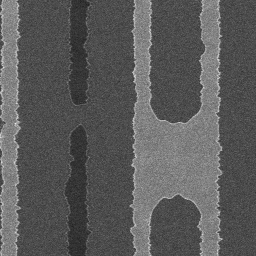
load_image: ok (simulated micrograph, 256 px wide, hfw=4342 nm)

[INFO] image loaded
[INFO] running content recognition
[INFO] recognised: one or a few lines or trenches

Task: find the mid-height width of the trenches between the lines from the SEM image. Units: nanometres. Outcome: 850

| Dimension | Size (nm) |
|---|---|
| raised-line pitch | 1130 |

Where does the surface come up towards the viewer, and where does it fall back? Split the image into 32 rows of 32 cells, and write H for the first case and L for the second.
HHLLLLLLLHHLLLLLLHHLLLLLLHHLLLLL
HHLLLLLLLHHLLLLLLHHLLLLLLHHLLLLL
HHLLLLLLLHHLLLLLLHHLLLLLLHHLLLLL
HHLLLLLLLHHLLLLLLHHLLLLLLHHLLLLL
HHLLLLLLLHHLLLLLLHHLLLLLLHHLLLLL
HHLLLLLLLHHLLLLLLHHLLLLLLLHLLLLL
HHLLLLLLLHHLLLLLLHHLLLLLLLHLLLLL
HHLLLLLLLHHLLLLLLHHLLLLLLHHLLLLL
HHLLLLLLLHHLLLLLLHHLLLLLLHHLLLLL
HHLLLLLLLHHLLLLLLHHLLLLLLHHLLLLL
HHLLLLLLLHHLLLLLLHHLLLLLLHHLLLLL
HHLLLLLLLHHLLLLLLHHLLLLLLHHLLLLL
HHLLLLLLLHHLLLLLLHHLLLLLLHHLLLLL
HHLLLLLLLLLLLLLLLHHLLLLLLHHLLLLL
HHLLLLLLLLLLLLLLLHHLLLLLHHHLLLLL
LHLLLLLLLLLLLLLLLHHHHHHHHHHLLLLL
HHLLLLLLLHHLLLLLLHHHHHHHHHHLLLLL
HHLLLLLLLHHLLLLLLHHHHHHHHHHLLLLL
HHLLLLLLLHHLLLLLLHHHHHHHHHHHLLLL
HHLLLLLLLHHLLLLLLHHHHHHHHHHLLLLL
HHLLLLLLLHHLLLLLLHHHHHHHHHHLLLLL
HHLLLLLLLHHLLLLLLHHHHHHHHHHHLLLL
HHLLLLLLHHHLLLLLLHHHHHHHHHHLLLLL
HHLLLLLLHHHLLLLLLHHHHHHHHHHLLLLL
HHLLLLLLHHHLLLLLLHHHHHLHHHHLLLLL
HHLLLLLLHHHLLLLLLHHHLLLLHHHLLLLL
HHLLLLLLLHHLLLLLLHHLLLLLLHHLLLLL
HHLLLLLLHHHLLLLLLHHLLLLLLHHLLLLL
HHLLLLLLLHHLLLLLLHHLLLLLLHHLLLLL
HHLLLLLLHHHLLLLLLHHLLLLLLHHLLLLL
HHLLLLLLHHHLLLLLLHHLLLLLLHHLLLLL
HHLLLLLLLHHLLLLLLHHLLLLLLHHLLLLL